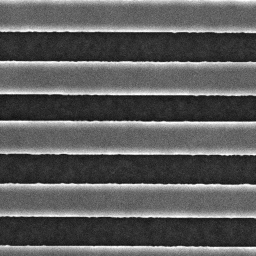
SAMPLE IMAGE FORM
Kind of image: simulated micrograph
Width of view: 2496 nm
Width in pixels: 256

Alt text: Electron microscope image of lines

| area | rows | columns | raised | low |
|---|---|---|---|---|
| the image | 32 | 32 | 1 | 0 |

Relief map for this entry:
11111111111111111111111111111111
11111111111111111111111111111111
11111111111111111111111111111111
11111111111111111111111111111111
00000000000000000000000000000000
00000000000000000000000000000000
00000000000000000000000000000000
00000000000000000000000000000000
11111111111111111111111111111111
11111111111111111111111111111111
11111111111111111111111111111111
11111111111111111111111111111111
00000000000000000000000000000000
00000000000000000000000000000000
00000000000000000000000000000000
11111111111111111111111111111111
11111111111111111111111111111111
11111111111111111111111111111111
11111111111111111111111111111111
00000000000000000000000000000000
00000000000000000000000000000000
00000000000000000000000000000000
00000000000000000000000000000000
11111111111111111111111111111111
11111111111111111111111111111111
11111111111111111111111111111111
11111111111111111111111111111111
00000000000000000000000000000000
00000000000000000000000000000000
00000000000000000000000000000000
00000000000000000000000000000000
11111111111111111111111111111111